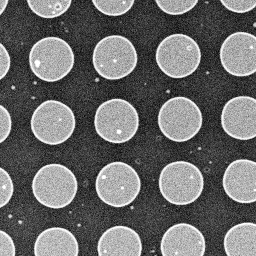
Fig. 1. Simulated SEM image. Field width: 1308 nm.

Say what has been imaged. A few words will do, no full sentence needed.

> an array of small figures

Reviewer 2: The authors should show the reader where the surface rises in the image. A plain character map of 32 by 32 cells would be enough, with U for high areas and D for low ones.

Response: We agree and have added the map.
UDDDUUUUUDDDUUUUUDDDUUUUDDDDUUUU
DDDDUUUUDDDDDUUUDDDDDUUDDDDDDUUD
DDDDDDDDDDDDDDDDDDDDDDDDDDDDDDDD
DDDDDDDDDDDDDDDDDDDDDDDDDDDDDDDD
DDDDDDDDDDDDDDUDDDDDDUUDDDDDDUUU
DDDDDUUUDDDDUUUUDDDDUUUUUDDDUUUU
UDDDUUUUUDDDUUUUUDDDUUUUUDDDUUUU
UDDDUUUUUDDDUUUUUDDDUUUUUDDDUUUU
UDDDUUUUUDDDUUUUUDDDUUUUDDDDUUUU
DDDDDUUUDDDDDUUUDDDDDUUDDDDDDDDD
DDDDDDDDDDDDDDDDDDDDDDDDDDDDDDDD
DDDDDDDDDDDDDDDDDDDDDDDDDDDDDDDD
DDDDDDDDDDDDDDUDDDDDDUUUDDDDDUUU
DDDDDUUUUDDDUUUUUDDDUUUUUDDDUUUU
UDDDUUUUUDDDUUUUUDDDUUUUUDDDUUUU
UDDDUUUUUDDDUUUUUDDDUUUUUDDDUUUU
UDDDUUUUUDDDUUUUUDDDUUUUUDDDUUUU
DDDDDUUUDDDDDUUUDDDDDDUDDDDDDDDD
DDDDDDDDDDDDDDDDDDDDDDDDDDDDDDDD
DDDDDDDDDDDDDDDDDDDDDDDDDDDDDDDD
DDDDDDDDDDDDDDUUDDDDDUUUDDDDDUUU
UDDDDUUUUDDDDUUUUDDDUUUUUDDDUUUU
UDDDUUUUUUDDUUUUUDDDUUUUUDDDUUUU
UUDDUUUUUUDDUUUUUDDDUUUUUDDDUUUU
UDDDUUUUUDDDUUUUUDDDUUUUUDDDDUUU
UDDDDUUUDDDDDDUUDDDDDDDDDDDDDDDD
DDDDDDDDDDDDDDDDDDDDDDDDDDDDDDDD
DDDDDDDDDDDDDDDDDDDDDDDDDDDDDDDD
DDDDDDDDDDDDDDUUDDDDDUUUDDDDDUUU
UDDDDUUUUDDDDUUUUDDDUUUUUDDDUUUU
UUDDUUUUUUDDUUUUUUDDUUUUUUDDUUUU
UUDDUUUUUUDDUUUUUUDDUUUUUUDDUUUU